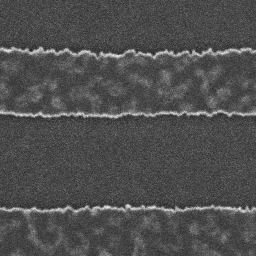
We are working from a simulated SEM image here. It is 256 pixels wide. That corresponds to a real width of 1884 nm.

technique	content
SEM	one or a few lines or trenches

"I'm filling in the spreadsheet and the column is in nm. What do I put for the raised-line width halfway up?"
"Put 459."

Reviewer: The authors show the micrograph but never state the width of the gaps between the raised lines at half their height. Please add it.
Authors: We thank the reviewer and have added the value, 690 nanometers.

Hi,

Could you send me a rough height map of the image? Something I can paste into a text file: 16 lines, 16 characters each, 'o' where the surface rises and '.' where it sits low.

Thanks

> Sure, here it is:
................
................
................
oooooooooooooooo
oooooooooooooooo
oooooooooooooooo
oooooooooooooooo
................
................
................
................
................
................
oooooooooooooooo
oooooooooooooooo
oooooooooooooooo